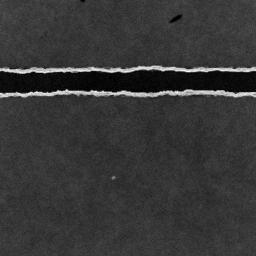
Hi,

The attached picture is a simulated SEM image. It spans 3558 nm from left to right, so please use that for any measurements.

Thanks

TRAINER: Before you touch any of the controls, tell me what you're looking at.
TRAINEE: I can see one or a few lines or trenches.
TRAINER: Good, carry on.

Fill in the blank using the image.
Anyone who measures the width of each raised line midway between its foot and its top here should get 335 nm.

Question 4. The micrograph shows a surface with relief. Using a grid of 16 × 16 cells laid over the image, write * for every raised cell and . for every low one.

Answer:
................
................
................
................
****************
****************
................
................
................
................
................
................
................
................
................
................